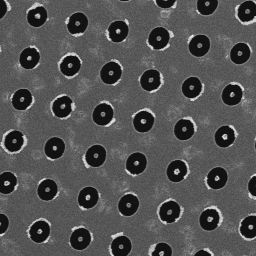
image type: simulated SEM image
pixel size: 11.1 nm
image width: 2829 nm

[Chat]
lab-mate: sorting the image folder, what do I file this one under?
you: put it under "a regular array of ring-shaped grooves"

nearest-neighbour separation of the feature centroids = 455 nanometers